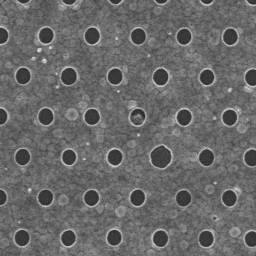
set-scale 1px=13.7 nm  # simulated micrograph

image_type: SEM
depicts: a regular array of holes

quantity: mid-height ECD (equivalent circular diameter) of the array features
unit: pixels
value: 16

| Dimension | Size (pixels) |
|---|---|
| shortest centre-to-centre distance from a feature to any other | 45.8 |